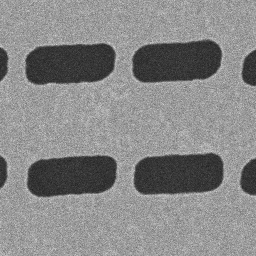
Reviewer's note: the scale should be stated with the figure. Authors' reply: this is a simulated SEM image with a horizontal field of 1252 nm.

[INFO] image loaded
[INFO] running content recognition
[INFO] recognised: holes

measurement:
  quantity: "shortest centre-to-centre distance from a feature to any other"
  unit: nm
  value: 524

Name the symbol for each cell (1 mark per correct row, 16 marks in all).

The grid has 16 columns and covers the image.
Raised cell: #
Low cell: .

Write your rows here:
################
################
################
##.....#......#.
##.....#.....##.
################
################
################
################
################
##.....#......#.
##.....#......#.
################
################
################
################